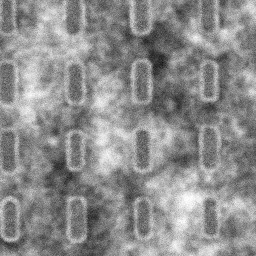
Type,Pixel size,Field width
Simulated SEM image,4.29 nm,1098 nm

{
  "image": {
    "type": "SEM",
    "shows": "a regular array of raised bodies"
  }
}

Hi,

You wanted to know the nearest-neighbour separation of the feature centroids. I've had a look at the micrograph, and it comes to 66.7 pixels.